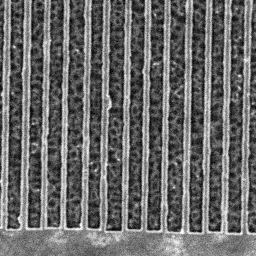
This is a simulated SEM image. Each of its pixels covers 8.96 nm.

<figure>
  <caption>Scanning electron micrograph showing parallel lines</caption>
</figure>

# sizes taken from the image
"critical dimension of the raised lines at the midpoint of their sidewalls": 0.0493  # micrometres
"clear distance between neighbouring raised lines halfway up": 133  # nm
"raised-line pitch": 180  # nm